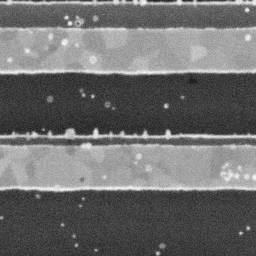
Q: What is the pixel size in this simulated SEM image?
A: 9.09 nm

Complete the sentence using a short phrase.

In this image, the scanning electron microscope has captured lines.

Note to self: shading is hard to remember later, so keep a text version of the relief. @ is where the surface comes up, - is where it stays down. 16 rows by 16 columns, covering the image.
@@@@@@@@@@@@@@@@
@@@@@@@@@@@@@@@@
@@@@@@@@@@@@@@@@
@@@@@@@@@@@@@@@@
-------@@-------
----------------
----------------
----------------
@@@@@@@@-@@@----
@@@@@@@@@@@@@@@@
@@@@@@@@@@@@@@@@
@@@@@@@@@@@@@@@@
----------------
----------------
----------------
----------------